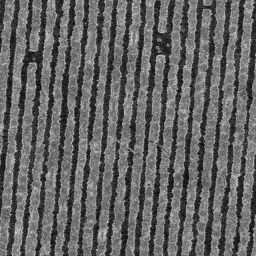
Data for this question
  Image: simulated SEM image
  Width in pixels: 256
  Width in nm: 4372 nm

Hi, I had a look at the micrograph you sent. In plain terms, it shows parallel lines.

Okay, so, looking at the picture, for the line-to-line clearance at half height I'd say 104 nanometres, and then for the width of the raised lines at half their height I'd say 136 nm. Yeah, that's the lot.